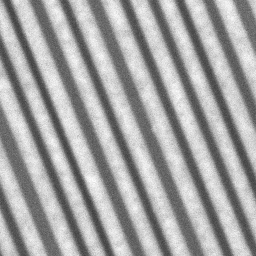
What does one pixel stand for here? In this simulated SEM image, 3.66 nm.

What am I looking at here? parallel lines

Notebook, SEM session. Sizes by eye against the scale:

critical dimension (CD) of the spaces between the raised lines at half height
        37.4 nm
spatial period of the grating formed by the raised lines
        97.4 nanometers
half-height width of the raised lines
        0.0556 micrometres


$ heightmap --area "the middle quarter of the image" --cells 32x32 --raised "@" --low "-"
-@@@@---@@@@----@@@@---@@@@---@@
--@@@@--@@@@@----@@@@---@@@@---@
--@@@@---@@@@----@@@@---@@@@---@
---@@@---@@@@----@@@@@---@@@@--@
---@@@@---@@@@----@@@@---@@@@---
---@@@@---@@@@----@@@@---@@@@---
----@@@@--@@@@@----@@@@---@@@@--
@---@@@@---@@@@----@@@@---@@@@--
@----@@@---@@@@----@@@@@--@@@@@-
@----@@@@---@@@@----@@@@---@@@@-
@@---@@@@---@@@@----@@@@---@@@@@
@@----@@@@--@@@@@----@@@@---@@@@
@@@---@@@@---@@@@----@@@@---@@@@
@@@----@@@---@@@@@---@@@@@---@@@
@@@----@@@@---@@@@----@@@@---@@@
@@@@---@@@@---@@@@----@@@@@--@@@
@@@@----@@@@--@@@@@---@@@@@---@@
@@@@@---@@@@---@@@@----@@@@---@@
-@@@@----@@@---@@@@@---@@@@@---@
-@@@@----@@@@---@@@@----@@@@---@
--@@@@----@@@---@@@@----@@@@@--@
--@@@@----@@@@--@@@@@----@@@@---
--@@@@@---@@@@---@@@@----@@@@---
---@@@@----@@@@--@@@@@---@@@@@--
@--@@@@----@@@@---@@@@----@@@@--
@---@@@@----@@@---@@@@----@@@@@-
@@--@@@@----@@@@---@@@@----@@@@-
@@--@@@@@---@@@@---@@@@----@@@@-
@@---@@@@----@@@@--@@@@@----@@@@
@@@--@@@@----@@@@---@@@@----@@@@
@@@---@@@@----@@@---@@@@----@@@@
@@@@--@@@@----@@@@---@@@@----@@@